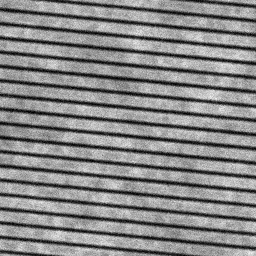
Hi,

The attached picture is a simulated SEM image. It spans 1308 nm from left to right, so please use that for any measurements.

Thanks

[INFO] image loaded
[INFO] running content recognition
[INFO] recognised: parallel lines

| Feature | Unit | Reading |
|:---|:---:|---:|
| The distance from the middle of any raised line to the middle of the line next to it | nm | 72.4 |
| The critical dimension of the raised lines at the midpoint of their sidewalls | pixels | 9.45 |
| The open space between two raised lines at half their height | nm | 24.2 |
